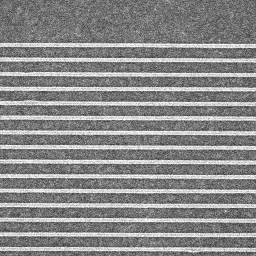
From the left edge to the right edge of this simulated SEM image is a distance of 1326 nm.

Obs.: parallel lines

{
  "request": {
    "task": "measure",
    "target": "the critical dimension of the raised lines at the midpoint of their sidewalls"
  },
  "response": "18.1 nm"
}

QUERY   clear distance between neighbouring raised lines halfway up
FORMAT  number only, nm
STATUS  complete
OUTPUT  58.9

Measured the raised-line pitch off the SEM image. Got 75.3 nanometers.